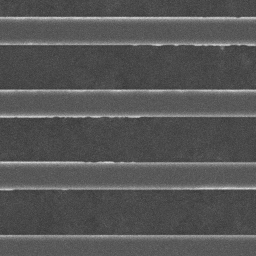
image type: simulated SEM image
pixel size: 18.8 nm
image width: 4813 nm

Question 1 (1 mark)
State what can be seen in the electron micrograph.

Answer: lines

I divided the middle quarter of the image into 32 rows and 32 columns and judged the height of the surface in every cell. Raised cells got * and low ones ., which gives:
................................
................................
................................
................................
................................
................................
................................
********************************
********************************
********************************
********************************
********************************
********************************
................................
................................
................................
................................
................................
................................
................................
................................
................................
................................
................................
................................
********************************
********************************
********************************
********************************
********************************
********************************
................................